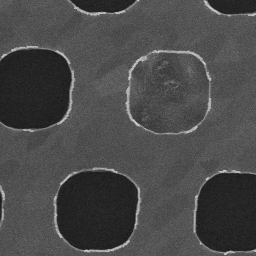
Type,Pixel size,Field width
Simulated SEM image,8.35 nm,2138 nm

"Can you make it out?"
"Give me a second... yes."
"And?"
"holes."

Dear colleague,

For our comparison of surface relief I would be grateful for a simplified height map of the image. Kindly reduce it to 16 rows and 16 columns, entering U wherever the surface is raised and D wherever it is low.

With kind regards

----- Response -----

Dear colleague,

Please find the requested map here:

UUUUUDDDUUUUUDDD
UUUUUUUUUUUUUUUU
UUUUUUUUUUUUUUUU
DDDDUUUUUUUUUUUU
DDDDUUUUUUUUUUUU
DDDDUUUUUUUUUUUU
DDDDUUUUUUUUUUUU
DDDDUUUUUUUUUUUU
UUUUUUUUUUUUUUUU
UUUUUUUUUUUUUUUU
UUUUUUUUUUUUUUUU
UUUUDDDDUUUUUDDD
UUUUDDDDDUUUDDDD
UUUUDDDDUUUUDDDD
UUUUDDDDUUUUDDDD
UUUUUDDUUUUUUDDD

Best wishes